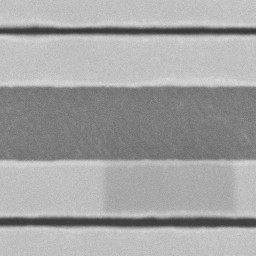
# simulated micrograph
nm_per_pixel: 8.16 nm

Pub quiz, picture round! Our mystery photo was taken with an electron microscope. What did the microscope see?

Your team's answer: lines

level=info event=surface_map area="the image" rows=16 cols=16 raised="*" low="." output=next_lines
****************
****************
****************
****************
****************
................
................
................
................
................
****************
****************
****************
****************
****************
****************